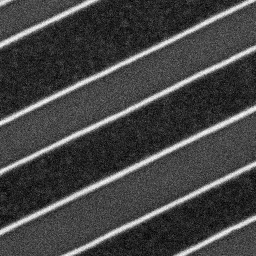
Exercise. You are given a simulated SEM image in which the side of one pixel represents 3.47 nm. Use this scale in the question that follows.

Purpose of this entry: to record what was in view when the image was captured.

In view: one or a few lines or trenches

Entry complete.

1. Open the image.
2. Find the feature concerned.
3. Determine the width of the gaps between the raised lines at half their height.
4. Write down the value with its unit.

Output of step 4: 150 nanometres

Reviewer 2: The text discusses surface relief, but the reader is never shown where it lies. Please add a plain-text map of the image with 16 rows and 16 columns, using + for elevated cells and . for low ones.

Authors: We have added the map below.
.....++++++++++.
...++++++++++...
.++++++++++.....
+++++++++......+
+++++++......+++
+++++......+++++
++.......+++++++
+......+++++++..
.....+++++++....
...+++++++......
++++++++.......+
++++++.......+++
++++.......+++++
++.......+++++++
.......+++++++..
.....+++++++....